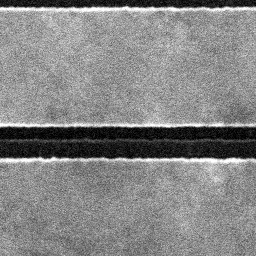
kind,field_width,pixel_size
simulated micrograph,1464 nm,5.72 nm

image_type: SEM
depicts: lines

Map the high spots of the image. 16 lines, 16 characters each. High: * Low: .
***..******...**
****************
****************
****************
****************
****************
****************
****************
................
................
****************
****************
****************
****************
****************
****************